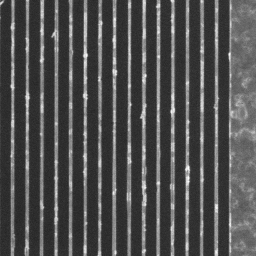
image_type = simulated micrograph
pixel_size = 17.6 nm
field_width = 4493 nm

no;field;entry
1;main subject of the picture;parallel lines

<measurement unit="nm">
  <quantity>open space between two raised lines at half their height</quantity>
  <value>213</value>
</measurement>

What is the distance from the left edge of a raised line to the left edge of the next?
256 nm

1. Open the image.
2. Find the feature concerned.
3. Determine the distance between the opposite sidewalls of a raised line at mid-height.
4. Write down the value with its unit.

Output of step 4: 46.1 nanometers